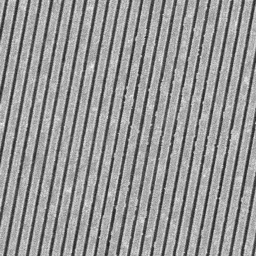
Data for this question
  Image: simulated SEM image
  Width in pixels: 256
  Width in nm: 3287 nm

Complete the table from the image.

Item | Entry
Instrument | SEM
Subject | parallel lines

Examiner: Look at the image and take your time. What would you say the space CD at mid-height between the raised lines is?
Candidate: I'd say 47.3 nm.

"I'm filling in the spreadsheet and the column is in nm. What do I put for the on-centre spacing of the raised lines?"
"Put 142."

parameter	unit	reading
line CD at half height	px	7.37